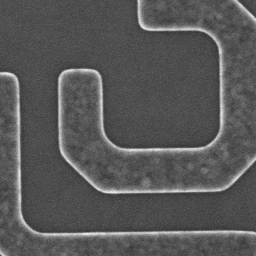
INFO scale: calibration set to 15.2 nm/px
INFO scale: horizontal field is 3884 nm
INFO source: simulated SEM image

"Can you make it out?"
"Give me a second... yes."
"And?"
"wiring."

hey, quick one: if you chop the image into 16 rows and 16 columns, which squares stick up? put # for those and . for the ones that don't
.........######.
.........#######
.............###
..............##
....##........##
#...##........##
#...##........##
#...##........##
#...###.......##
#...############
#....###########
#.....########..
#...............
#...............
##.......#######
################